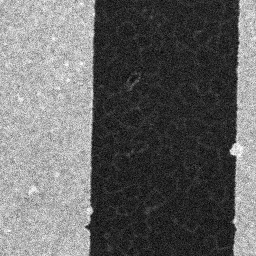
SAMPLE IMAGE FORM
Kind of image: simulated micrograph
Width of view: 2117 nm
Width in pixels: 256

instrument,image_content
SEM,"one or a few lines or trenches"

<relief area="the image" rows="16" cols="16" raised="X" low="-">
XXXXXX---------X
XXXXXX---------X
XXXXXX---------X
XXXXXX---------X
XXXXXX---------X
XXXXXX---------X
XXXXXX---------X
XXXXXX---------X
XXXXXX---------X
XXXXXX---------X
XXXXXX---------X
XXXXXX---------X
XXXXXX---------X
XXXXXX---------X
XXXXX----------X
XXXXXX---------X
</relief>